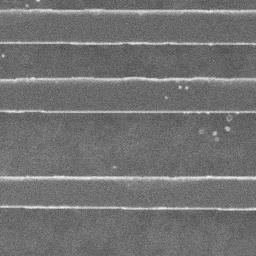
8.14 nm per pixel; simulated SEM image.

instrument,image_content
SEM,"lines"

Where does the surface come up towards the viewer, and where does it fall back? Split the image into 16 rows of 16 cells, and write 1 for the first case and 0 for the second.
0000000000000000
1111111111111111
1111111111111111
0000000000000000
0000000000000000
1111111111111111
1111111111111111
0000000000000000
0000000000000000
0000000000000000
0000000000000000
1111111111111111
1111111111111111
0000000000000000
0000000000000000
0000000000000000